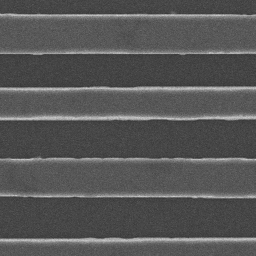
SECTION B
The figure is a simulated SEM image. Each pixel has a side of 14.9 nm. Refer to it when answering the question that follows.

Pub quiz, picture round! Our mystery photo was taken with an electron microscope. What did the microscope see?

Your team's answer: lines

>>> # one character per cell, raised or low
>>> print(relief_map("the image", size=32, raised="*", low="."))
................................
................................
********************************
********************************
********************************
********************************
********************************
................................
................................
................................
................................
********************************
********************************
********************************
********************************
................................
................................
................................
................................
................................
********************************
********************************
********************************
********************************
.....****.***.******************
................................
................................
................................
................................
................................
********************************
********************************